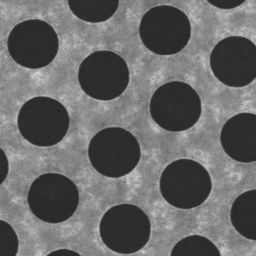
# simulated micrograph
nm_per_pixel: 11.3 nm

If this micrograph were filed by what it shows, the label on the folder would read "a regular array of holes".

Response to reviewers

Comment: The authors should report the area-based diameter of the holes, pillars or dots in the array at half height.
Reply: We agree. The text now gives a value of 581 nm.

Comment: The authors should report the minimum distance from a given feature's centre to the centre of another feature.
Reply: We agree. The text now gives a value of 0.863 µm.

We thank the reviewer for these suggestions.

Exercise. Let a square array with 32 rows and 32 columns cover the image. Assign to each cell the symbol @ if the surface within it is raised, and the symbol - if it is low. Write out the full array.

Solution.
@@@@@@@@-------@@@@@@@@@@@----@@
@@@@@@@@@-----@@@@-----@@@@@@@@@
@@@--@@@@@---@@@@@------@@@@@@@@
@@-----@@@@@@@@@@-------@@@@@@@@
@------@@@@@@@@@@-------@@@@@-@@
@------@@@@@@@@@@@-----@@@@-----
@------@@@@@--@@@@@---@@@@------
@@-----@@@------@@@@@@@@@@------
@@@--@@@@@------@@@@@@@@@@------
@@@@@@@@@@------@@@@@@@@@@@-----
@@@@@@@@@@------@@@@@---@@@@---@
@@@@@@@@@@@----@@@@------@@@@@@@
@@@@---@@@@@@-@@@@@------@@@@@@@
@@@-----@@@@@@@@@@@------@@@@@@@
@@-------@@@@@@@@@@------@@@@---
@@-------@@@@@@@@@@@----@@@@----
@@------@@@@----@@@@@@@@@@@@----
@@@-----@@@------@@@@@@@@@@@----
@@@@@@@@@@@-------@@@@@@@@@@----
-@@@@@@@@@@-------@@@@@@@@@@@---
-@@@@@@@@@@------@@@@----@@@@@@@
-@@@@@@@@@@@----@@@@------@@@@@@
-@@@-----@@@@@@@@@@@------@@@@@@
@@@@------@@@@@@@@@@------@@@@@@
@@@-------@@@@@@@@@@------@@@@--
@@@-------@@@@@-@@@@@----@@@@---
@@@@-----@@@@-----@@@@@@@@@@@---
@@@@@---@@@@@------@@@@@@@@@@---
--@@@@@@@@@@-------@@@@@@@@@@---
--@@@@@@@@@@@------@@@@@-@@@@@--
--@@@@@@@@@@@-----@@@@-----@@@@@
--@@@@---@@@@@@--@@@@------@@@@@